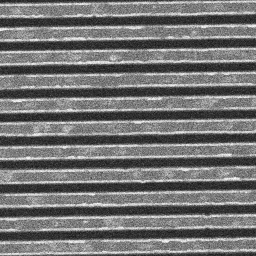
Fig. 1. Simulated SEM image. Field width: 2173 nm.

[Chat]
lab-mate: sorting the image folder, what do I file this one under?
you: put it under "parallel lines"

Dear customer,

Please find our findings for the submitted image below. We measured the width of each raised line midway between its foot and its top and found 124 nanometers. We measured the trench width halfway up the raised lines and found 79.6 nm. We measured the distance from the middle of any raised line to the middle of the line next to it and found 23.7 pixels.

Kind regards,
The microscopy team